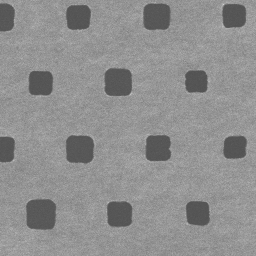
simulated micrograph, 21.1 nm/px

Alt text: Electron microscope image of a regular array of holes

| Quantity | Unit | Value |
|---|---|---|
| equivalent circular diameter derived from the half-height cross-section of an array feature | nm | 562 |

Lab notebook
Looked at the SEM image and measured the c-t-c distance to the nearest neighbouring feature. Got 1600 nanometers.